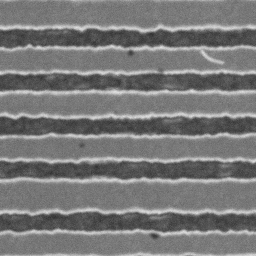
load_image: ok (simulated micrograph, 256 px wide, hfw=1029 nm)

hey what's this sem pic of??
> lines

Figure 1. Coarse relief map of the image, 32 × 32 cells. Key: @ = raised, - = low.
@@@@@@@@@@@@@@@@@@@@@@@@@@@@@@@@
@@@@@@@@@@@@@@@@@@@@@@@@@@@@@@@@
@@@@@@@@@@@@@@@@@@@@@@@@@@@@@@@@
@@@@@@@@@@@-@@@@@@@@@@@@@@-@@@@@
--------------------------------
--------------------------------
@@@@@@@@@@@@@@@@@@@@@@@@@@@@@@@@
@@@@@@@@@@@@@@@@@@@@@@@@@@@@@@@@
@@@@@@@@@@@@@@@@@@@@@@@@@@@@@@@@
--------------------------------
--------------------------------
@@@@@@@@@@@@@@@@@@@@@@@@@@@@@@@@
@@@@@@@@@@@@@@@@@@@@@@@@@@@@@@@@
@@@@@@@@@@@@@@@@@@@@@@@@@@@@@@@@
-@@@@@@@@@@@@@@@@@@@@@-@@@@@-@@@
--------------------------------
--------------------------------
@@@@@@@@@@@@@@@@@@@@@@@@@@@@@@@@
@@@@@@@@@@@@@@@@@@@@@@@@@@@@@@@@
@@@@@@@@@@@@@@@@@@@@@@@@@@@@@@@@
--------------------------------
--------------------------------
@@@@@@@@@@@@@@@-@@@@@@@@@@@@@@@@
@@@@@@@@@@@@@@@@@@@@@@@@@@@@@@@@
@@@@@@@@@@@@@@@@@@@@@@@@@@@@@@@@
@@@@@@@@@@@@@@@@@@@@@@@@@@@@@@@@
@@@@@@@@@@--@@@@--@@@-@@@@@@@@@@
--------------------------------
--------------------------------
@@@@@@@@@@@@@@@@@@@@@@@@@@@@@@@@
@@@@@@@@@@@@@@@@@@@@@@@@@@@@@@@@
@@@@@@@@@@@@@@@@@@@@@@@@@@@@@@@@